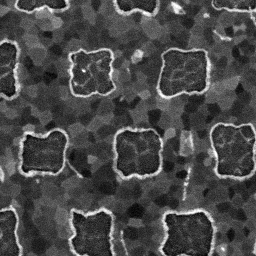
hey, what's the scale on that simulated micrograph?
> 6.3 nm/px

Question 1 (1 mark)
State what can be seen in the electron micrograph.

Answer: holes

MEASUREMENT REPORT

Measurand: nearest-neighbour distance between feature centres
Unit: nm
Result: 578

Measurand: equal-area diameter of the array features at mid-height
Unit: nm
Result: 304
